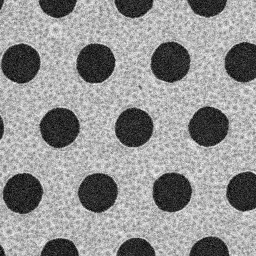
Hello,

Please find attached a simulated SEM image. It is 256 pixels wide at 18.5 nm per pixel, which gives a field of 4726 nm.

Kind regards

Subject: a regular array of holes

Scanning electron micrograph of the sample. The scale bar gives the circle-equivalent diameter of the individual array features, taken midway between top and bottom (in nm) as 757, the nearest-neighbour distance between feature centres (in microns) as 1.37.